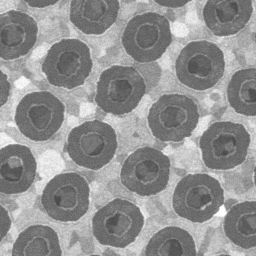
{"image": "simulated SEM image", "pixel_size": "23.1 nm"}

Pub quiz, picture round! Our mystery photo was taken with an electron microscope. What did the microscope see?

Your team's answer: a regular array of ring-shaped grooves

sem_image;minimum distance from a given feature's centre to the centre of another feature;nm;1350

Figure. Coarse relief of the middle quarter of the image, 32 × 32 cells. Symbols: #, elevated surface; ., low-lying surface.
####...#####....############...#
###....###........##########...#
##.....##..........#########....
......###...........########....
.....###....####....#########...
....####...######....##########.
########...######...############
########...######...#####.#..###
########...#####....####........
########.....##....####.........
########..........####....#.....
#########........####....#####..
###########.....#####...#######.
#####################...######..
#####......##########...######..
###.........#########....####...
##...........#########..........
#.....##.....#########..........
#...######...##########.......##
#...######...############.#..###
#...######...###################
#....#####...#####......########
#....####....####........#######
##..........####..........######
##..........###....####....#####
####......#####...######...#####
#######..#####....######...#####
....##########....######..#####.
.....#########....#####...####..
......########......#.....###...
##....#########...........##....
###....#########.........##.....